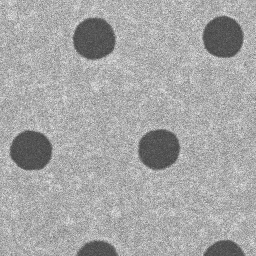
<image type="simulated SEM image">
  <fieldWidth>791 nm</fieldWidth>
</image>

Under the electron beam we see holes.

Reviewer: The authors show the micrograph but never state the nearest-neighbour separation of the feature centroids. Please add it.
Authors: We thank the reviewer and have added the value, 397 nanometres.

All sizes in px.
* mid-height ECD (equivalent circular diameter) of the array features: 41.3